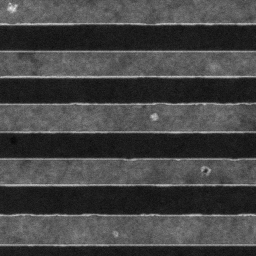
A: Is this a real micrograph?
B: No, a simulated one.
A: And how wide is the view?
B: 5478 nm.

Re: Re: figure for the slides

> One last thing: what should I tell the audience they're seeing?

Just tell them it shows lines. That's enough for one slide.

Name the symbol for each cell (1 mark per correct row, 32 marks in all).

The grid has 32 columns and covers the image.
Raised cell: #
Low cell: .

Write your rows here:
................................
................................
................................
################################
################################
################################
................................
................................
................................
................................
################################
################################
################################
................................
................................
................................
................................
################################
################################
################################
................................
................................
................................
################################
################################
################################
################################
................................
................................
................................
................................
################################